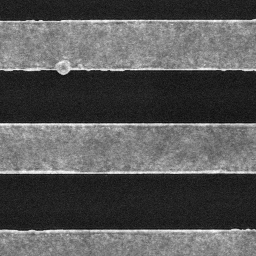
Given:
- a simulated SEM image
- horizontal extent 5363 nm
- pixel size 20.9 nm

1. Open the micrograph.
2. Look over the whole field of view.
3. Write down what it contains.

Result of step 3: lines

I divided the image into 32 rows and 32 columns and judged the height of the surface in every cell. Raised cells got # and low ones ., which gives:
................................
................................
................................
################################
################################
################################
################################
################################
################################
................................
................................
................................
................................
................................
................................
................................
################################
################################
################################
################################
################################
##########################.#####
................................
................................
................................
................................
................................
................................
................................
################################
################################
################################